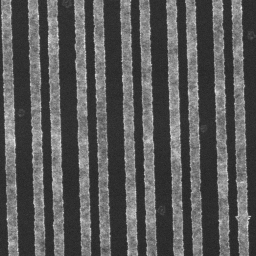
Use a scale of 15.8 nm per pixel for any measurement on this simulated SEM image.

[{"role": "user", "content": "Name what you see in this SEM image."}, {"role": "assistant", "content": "parallel lines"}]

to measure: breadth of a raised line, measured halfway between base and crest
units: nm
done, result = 144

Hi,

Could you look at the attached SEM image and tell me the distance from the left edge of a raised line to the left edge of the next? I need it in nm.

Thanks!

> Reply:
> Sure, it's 364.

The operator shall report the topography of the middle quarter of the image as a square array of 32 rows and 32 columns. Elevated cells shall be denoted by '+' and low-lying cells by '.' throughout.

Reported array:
...++...++.....++..+++....++...+
...++...++.....++...++....++...+
...++...++.....++...++....++...+
...++...++.....++...++....++...+
...++...++.....++...++....++...+
...+++..++.....++...++....++...+
...++...++.....++...++....+++..+
...+++..++.....++...++.....++..+
...++...++.....++...++.....++..+
....+...++.....++...++....+++..+
...+++..++.....++...++.....++..+
...+++..++.....++...++.....++..+
...+++..++.....++...++.....++..+
...+++..++.....++...++.....++..+
....++..+++....++...++.....++..+
....++..+++....++...++.....++..+
....++..++.....++...++.....++..+
....++..+++....++...++.....++...
....++...++....++...++.....++...
....++..+++....+++..++.....++...
....++...++....++...++.....++...
....++...++....++...++.....++...
....++...++....+++..++.....++...
....++...++....+++..++.....++...
....++...++....+++..++.....++...
....++...++....+++..++.....++...
....++...++....+++..++.....++...
....++...++.....++..++.....++...
....++...++.....++..++.....++...
....++...++.....++..++.....++...
....++...++.....++..+++....++...
....++...++.....++..+++....++...